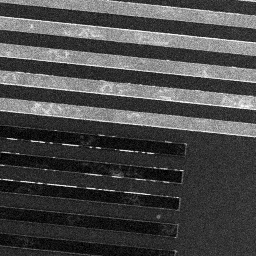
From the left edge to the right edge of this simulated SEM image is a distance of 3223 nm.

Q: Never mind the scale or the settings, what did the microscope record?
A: parallel lines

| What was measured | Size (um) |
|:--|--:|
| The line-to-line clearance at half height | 0.186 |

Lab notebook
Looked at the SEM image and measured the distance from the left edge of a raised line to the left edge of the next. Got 0.339 micrometres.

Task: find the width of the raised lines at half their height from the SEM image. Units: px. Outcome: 12.3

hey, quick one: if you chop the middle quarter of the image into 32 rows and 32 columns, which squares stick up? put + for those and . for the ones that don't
........++++++++++++++++++++++++
.................+++++++++++++++
...........................+++++
+...............................
+++++++++++.....................
++++++++++++++++++++............
..++++++++++++++++++++++++++++..
............++++++++++++++++++++
.....................+++++++++++
...............................+
+++.............................
+++++++++++++...................
++++++++++++++++++++++..........
..++++++++++++++++++++++++++++++
.............+++++++++++++++++++
.......................+++++++++
................................
+++++...........................
++++++++++++++..................
++++++++++++++++++++++++........
......++++++++++++++++++++++++..
...............+++++++++++++++..
.........................+++++..
................................
+++++++.........................
++++++++++++++++................
++++++++++++++++++++++++++......
........++++++++++++++++++++++..
.................+++++++++++++..
...........................++...
................................
+++++++++.......................